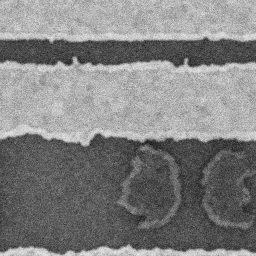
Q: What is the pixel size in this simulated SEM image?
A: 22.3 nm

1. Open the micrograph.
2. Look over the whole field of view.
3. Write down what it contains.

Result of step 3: one or a few lines or trenches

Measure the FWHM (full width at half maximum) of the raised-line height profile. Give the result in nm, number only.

1530